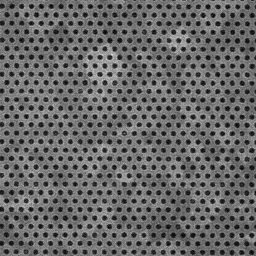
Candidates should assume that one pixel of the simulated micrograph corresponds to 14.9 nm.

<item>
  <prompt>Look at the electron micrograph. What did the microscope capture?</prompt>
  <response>a regular array of holes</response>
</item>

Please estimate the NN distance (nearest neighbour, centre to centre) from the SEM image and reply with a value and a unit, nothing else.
0.143 micrometres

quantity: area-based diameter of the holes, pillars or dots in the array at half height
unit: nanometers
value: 84.3